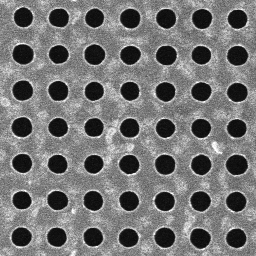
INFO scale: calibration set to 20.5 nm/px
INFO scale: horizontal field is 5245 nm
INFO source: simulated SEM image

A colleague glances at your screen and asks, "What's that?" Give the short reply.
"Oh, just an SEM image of a regular array of holes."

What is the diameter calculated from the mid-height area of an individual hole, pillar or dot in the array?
404 nm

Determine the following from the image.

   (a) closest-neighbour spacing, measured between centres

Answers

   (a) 730 nm